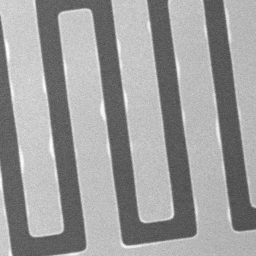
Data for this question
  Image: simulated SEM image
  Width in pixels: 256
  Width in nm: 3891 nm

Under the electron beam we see groups of lines, slits or small figures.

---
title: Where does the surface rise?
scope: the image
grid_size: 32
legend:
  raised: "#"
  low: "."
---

####..........####...####...####
####....###...#####..####...####
#####..#####..#####..#####..####
#####..#####..#####..#####...###
.####...####...####...####...###
.####...####...####...####...###
.####...####...####...####...###
.####...####...####...####...###
.####...####...####...####...###
.####...#####..#####..#####..###
.#####..#####..#####..#####..###
..####..#####...####..#####...##
..####...####...####...####...##
..####...####...####...####...##
..####...####...####...####...##
..####...####...####...####...##
..####...####...####...####...##
..####...#####..#####..####...##
..####...#####..#####..#####..##
...####..#####..#####...####..##
...####...####...####...####...#
...####...####...####...####...#
...####...####...####...####...#
...####...####...####...####...#
...####...####...####...####...#
#..#####..#####..####...#####..#
#..#####..#####..#####...####...
#..#####...####...###....####...
#...####...####..........####...
#...#......####.........########
#..........####...##############
#.........######################